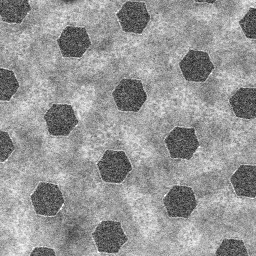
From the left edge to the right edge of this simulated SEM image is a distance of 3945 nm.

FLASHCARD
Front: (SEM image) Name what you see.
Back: a regular array of raised bodies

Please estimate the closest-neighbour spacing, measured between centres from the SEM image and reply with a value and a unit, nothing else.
1090 nm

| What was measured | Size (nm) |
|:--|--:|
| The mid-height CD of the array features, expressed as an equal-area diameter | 526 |